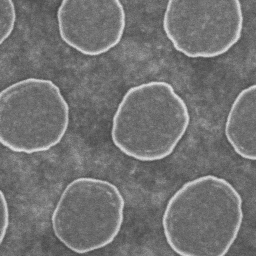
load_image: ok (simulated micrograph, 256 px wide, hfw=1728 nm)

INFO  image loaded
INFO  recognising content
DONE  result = raised bodies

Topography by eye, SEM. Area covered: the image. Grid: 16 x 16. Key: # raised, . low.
#...####..#####.
#...####..#####.
....###....####.
................
................
###......##.....
####....###....#
####...#####..##
####...####...##
........##.....#
................
....###.....##..
....####...####.
...#####..#####.
...####...#####.
....##.....###..